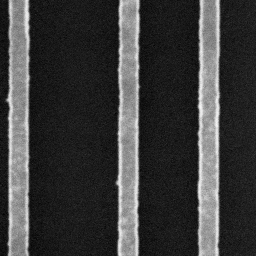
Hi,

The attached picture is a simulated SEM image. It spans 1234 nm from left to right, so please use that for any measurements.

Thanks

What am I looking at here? lines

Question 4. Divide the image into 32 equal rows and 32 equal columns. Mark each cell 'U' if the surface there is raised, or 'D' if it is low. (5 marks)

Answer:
DUUDDDDDDDDDDDDUUDDDDDDDDUUDDDDD
DUUDDDDDDDDDDDDUUDDDDDDDDUUDDDDD
DUUDDDDDDDDDDDDUUDDDDDDDDUUDDDDD
DUUDDDDDDDDDDDDUUDDDDDDDDUUDDDDD
DUUDDDDDDDDDDDDUUDDDDDDDDUUDDDDD
DUUDDDDDDDDDDDDUUDDDDDDDDUUDDDDD
DUUDDDDDDDDDDDDUUDDDDDDDDUUDDDDD
DUUDDDDDDDDDDDDUUDDDDDDDDUUDDDDD
DUUDDDDDDDDDDDDUUDDDDDDDDUUDDDDD
DUUDDDDDDDDDDDDUUDDDDDDDDUUDDDDD
DUUDDDDDDDDDDDDUUDDDDDDDDUUDDDDD
DUUDDDDDDDDDDDDUUDDDDDDDDUUDDDDD
DUUDDDDDDDDDDDDUUDDDDDDDDUUDDDDD
DUUDDDDDDDDDDDDUUDDDDDDDDUUDDDDD
DUUDDDDDDDDDDDDUUDDDDDDDDUUDDDDD
DUUDDDDDDDDDDDDUUDDDDDDDDUUDDDDD
DUUDDDDDDDDDDDDUUDDDDDDDDUUDDDDD
DUUDDDDDDDDDDDDUUDDDDDDDDUUDDDDD
DUUDDDDDDDDDDDDUUDDDDDDDDUUDDDDD
DUUDDDDDDDDDDDDUUDDDDDDDDUUDDDDD
DUUDDDDDDDDDDDDUUDDDDDDDDUUDDDDD
DUUDDDDDDDDDDDDUUDDDDDDDDUUDDDDD
DUUDDDDDDDDDDDDUUDDDDDDDDUUDDDDD
DUUDDDDDDDDDDDDUUDDDDDDDDUUDDDDD
DUUDDDDDDDDDDDDUUDDDDDDDDUUDDDDD
DUUDDDDDDDDDDDDUUDDDDDDDDUUDDDDD
DUUDDDDDDDDDDDDUUDDDDDDDDUUDDDDD
DUUDDDDDDDDDDDDUUDDDDDDDDUUDDDDD
DUUDDDDDDDDDDDDUUDDDDDDDDUUDDDDD
DUUDDDDDDDDDDDDUUDDDDDDDDUUDDDDD
DUUDDDDDDDDDDDDUUDDDDDDDDUUDDDDD
DUUDDDDDDDDDDDDUUDDDDDDDDUUDDDDD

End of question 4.